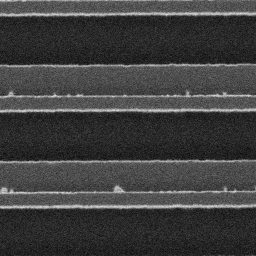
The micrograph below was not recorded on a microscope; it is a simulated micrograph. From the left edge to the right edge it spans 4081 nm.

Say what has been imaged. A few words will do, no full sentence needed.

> lines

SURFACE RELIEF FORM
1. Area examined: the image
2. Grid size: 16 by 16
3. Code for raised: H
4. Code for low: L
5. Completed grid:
HHHHHHHHHHHHHHHH
LLLLLLLLLLLLLLLL
LLLLLLLLLLLLLLLL
LLLLLLLLLLLLLLLL
HHHHHHHHHHHHHHHH
HHHHHHHHHHHHHHHH
HHHHHHHHHHHHHHHH
LLLLLLLLLLLLLLLL
LLLLLLLLLLLLLLLL
LLLLLLLLLLLLLLLL
HHHHHHHHHHHHHHHH
HHHHHHHHHHHHHHHH
HHHHHHHHHHHHHHHH
LLLLLLLLLLLLLLLL
LLLLLLLLLLLLLLLL
LLLLLLLLLLLLLLLL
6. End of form